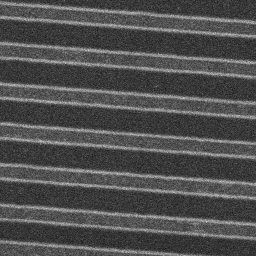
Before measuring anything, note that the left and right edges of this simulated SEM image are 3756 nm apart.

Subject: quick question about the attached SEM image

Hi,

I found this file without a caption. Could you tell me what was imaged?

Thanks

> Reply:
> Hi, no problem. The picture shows parallel lines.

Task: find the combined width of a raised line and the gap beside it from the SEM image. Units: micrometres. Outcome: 0.591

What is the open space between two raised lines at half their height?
371 nm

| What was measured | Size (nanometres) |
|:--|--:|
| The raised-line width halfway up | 218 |